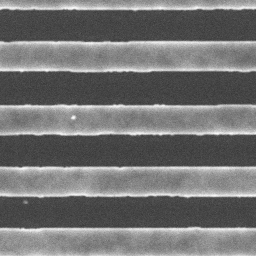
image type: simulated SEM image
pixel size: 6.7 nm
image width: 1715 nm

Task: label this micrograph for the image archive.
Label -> lines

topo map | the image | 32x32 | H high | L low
HHHHHHHHHHHHHHHHHHHHHHHHHHHHHHHH
LLLLLLLLLLLLLLLLLLLLLLLLLLLLLLLL
LLLLLLLLLLLLLLLLLLLLLLLLLLLLLLLL
LLLLLLLLLLLLLLLLLLLLLLLLLLLLLLLL
LLLLLLLLLLLLLLLLLLLLLLLLLLLLLLLL
HHHHHHHHHHHHHHHHHHHHHHHHHHHHHHHH
HHHHHHHHHHHHHHHHHHHHHHHHHHHHHHHH
HHHHHHHHHHHHHHHHHHHHHHHHHHHHHHHH
HHHHHHHHHHHHHHHHHHHHHHHHHHHHHHHH
LLLLLLLLLLLLLLLLLLLLLLLLLLLLLLLL
LLLLLLLLLLLLLLLLLLLLLLLLLLLLLLLL
LLLLLLLLLLLLLLLLLLLLLLLLLLLLLLLL
LLLLLLLLLLLLLLLLLLLLLLLLLLLLLLLL
HHHHHHHHHHHHHHHHHHHHHHHHHHHHHHHH
HHHHHHHHHHHHHHHHHHHHHHHHHHHHHHHH
HHHHHHHHHHHHHHHHHHHHHHHHHHHHHHHH
HHHHHHHHHHHHHHHHHHHHHHHHHHHHHHHH
LLLLLLLLLLLLLLLLLLLLLLLLLLLLLLLL
LLLLLLLLLLLLLLLLLLLLLLLLLLLLLLLL
LLLLLLLLLLLLLLLLLLLLLLLLLLLLLLLL
LLLLLLLLLLLLLLLLLLLLLLLLLLLLLLLL
HHHHHHHHHHHHHHHHHHHHHHHHHHHHHHHH
HHHHHHHHHHHHHHHHHHHHHHHHHHHHHHHH
HHHHHHHHHHHHHHHHHHHHHHHHHHHHHHHH
HHHHHHHHHLHHHHHHHHHLLHHHHHHHHHHH
LLLLLLLLLLLLLLLLLLLLLLLLLLLLLLLL
LLLLLLLLLLLLLLLLLLLLLLLLLLLLLLLL
LLLLLLLLLLLLLLLLLLLLLLLLLLLLLLLL
LLLLLLLLLLLLLLLLLLLLLLLLHLLLLLLL
HHHHHHHHHHHHHHHHHHHHHHHHHHHHHHHH
HHHHHHHHHHHHHHHHHHHHHHHHHHHHHHHH
HHHHHHHHHHHHHHHHHHHHHHHHHHHHHHHH